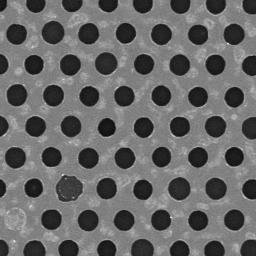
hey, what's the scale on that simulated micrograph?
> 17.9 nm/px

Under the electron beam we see a regular array of holes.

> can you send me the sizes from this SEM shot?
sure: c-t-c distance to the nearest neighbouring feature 630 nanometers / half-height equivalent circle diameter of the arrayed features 20.8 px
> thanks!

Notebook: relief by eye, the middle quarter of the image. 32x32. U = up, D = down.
DDDDUUUUDDDDDUUUUDDDDDDUUUDDDDDD
DDDDUUUUDDDDDUUUUUDDDDUUUUDDDDDU
DDDUUUUUUDDDUUUUUUUDDUUUUUUDDDUU
UUUUUUUUUUUUUUUUUUUUUUUUUUUUUUUU
UUUUUUUUUUUUUUUUUUUUUUUUUUUUUUUU
UUUUUUDUUUUUUUDDUUUUUUUDDUUUUUUU
UUUUDDDDUUUUUDDDDUUUUUDDDDUUUUUU
UUUUDDDDDUUUDDDDDDUUUUDDDDDUUUUD
UUUUDDDDDUUUDDDDDDUUUUDDDDDUUUUD
UUUUDDDDUUUUUDDDDUUUUUDDDDUUUUUD
UUUUUDDUUUUUUUDDUUUUUUUUDUUUUUUU
UUUUUUUUUUUUUUUUUUUUUUUUUUUUUUUU
UUUUUUUUUUUUUUUUUUUUUUUUUUUUUUUU
DDDUUUUUUUDUUUUUUUUDDUUUUUUUDDUU
DDDDUUUUUDDDUUUUUUDDDDUUUUUDDDDU
DDDDUUUUUDDDDUUUUDDDDDUUUUDDDDDU
DDDDUUUUUDDDDUUUUDDDDDUUUUUDDDDU
DDDDUUUUUDDDUUUUUUDDDDUUUUUDDDDU
UUUUUUUUUUUUUUUUUUUUUUUUUUUUUUUU
UUUUUUUUUUUUUUUUUUUUUUUUUUUUUUUU
UUUUUUUUUUUUUUUUUUUUUUUUUUUUUUUU
UUUUDDDDUUUUUUDDDUUUUUUDDDUUUUUU
UUUUDDDDDUUUUDDDDDUUUUDDDDDUUUUD
UUUDDDDDDUUUUDDDDDUUUUDDDDDUUUUD
UUUUDDDDDUUUUDDDDDUUUUDDDDDUUUUD
UUUUDDDDUUUUUDDDDUUUUUUDDDUUUUUU
UUUUUUUUUUUUUUUUUUUUUUUUUUUUUUUU
UUUUUUUUUUUUUUUUUUUUUUUUUUUUUUUU
DDDUUUUUUUDUUUUUUUUUUUUUUUUUDDUU
DDDDUUUUUDDDDUUUUUDDDUUUUUUDDDDU
DDDDDUUUDDDDDUUUUDDDDDUUUUDDDDDD
DDDDDUUUDDDDDUUUUDDDDDUUUUDDDDDD